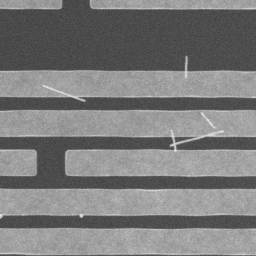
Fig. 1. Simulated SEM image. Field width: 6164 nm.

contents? groups of lines, slits or small figures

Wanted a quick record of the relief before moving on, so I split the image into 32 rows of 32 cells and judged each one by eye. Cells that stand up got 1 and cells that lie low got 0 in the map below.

11111111000111111111111111111111
00000000000000000000000000000000
00000000000000000000000000000000
00000000000000000000000000000000
00000000000000000000000000000000
00000000000000000000000000000000
00000000000000000000000000000000
00000000000000000000000000000000
00000000000000000000000000000000
11111111111111111111111111111111
11111111111111111111111111111111
11111111111111111111111111111111
00000000000000000000000000000000
00000000000000000000000000000000
11111111111111111111111111111111
11111111111111111111111111111111
11111111111111111111111111111111
00000000000000000000000000000000
00000000000000000000000000000000
11110000111111111111111111111111
11110000111111111111111111111111
11110000111111111111111111111111
00000000000000000000000000000000
00000000000000000000000000000000
11111111111111111111111111111111
11111111111111111111111111111111
11111111111111111111111111111111
00000000000000000000000000000000
00000000000000000000000000000000
11111111111111111111111111111111
11111111111111111111111111111111
11111111111111111111111111111111